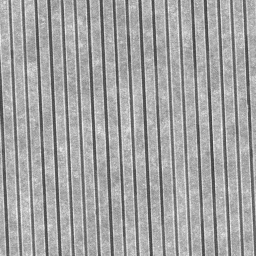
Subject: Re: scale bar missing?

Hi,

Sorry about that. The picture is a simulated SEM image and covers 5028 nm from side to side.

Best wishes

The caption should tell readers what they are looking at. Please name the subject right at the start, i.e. parallel lines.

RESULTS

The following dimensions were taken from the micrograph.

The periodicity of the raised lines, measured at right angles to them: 0.256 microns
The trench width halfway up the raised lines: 68.6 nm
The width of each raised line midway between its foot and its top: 191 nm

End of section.